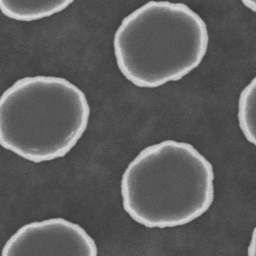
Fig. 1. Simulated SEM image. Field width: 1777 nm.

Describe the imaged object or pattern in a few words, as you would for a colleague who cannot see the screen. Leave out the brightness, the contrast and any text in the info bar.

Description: raised bodies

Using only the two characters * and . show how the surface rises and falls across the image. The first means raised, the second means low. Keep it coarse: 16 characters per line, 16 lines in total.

****.....**.....
........*****...
.......******...
.......******...
........****....
.****...........
*****..........*
*****..........*
*****...........
.***.....***....
........*****...
........*****...
........*****...
........****....
.****...........
******..........